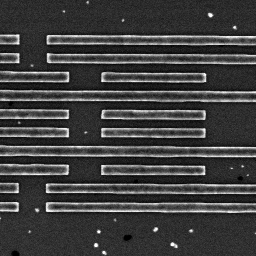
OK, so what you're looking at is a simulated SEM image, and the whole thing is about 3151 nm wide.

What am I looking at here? wiring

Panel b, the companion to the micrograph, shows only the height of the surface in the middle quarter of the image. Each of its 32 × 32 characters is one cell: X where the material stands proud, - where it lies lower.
--------------------------------
--------------------------------
X--------XXXXXXXXXXXXXXXXXXXXXXX
X--------XXXXXXXXXXXXXXXXXXXXXXX
--------------------------------
--------------------------------
--------------------------------
XXXXXXXXXXXXXXXXXXXXXXXXXXXXXXXX
XXXXXXXXXXXXXXXXXXXXXXXXXXXXXXXX
--------------------------------
--------------------------------
--------------------------------
X--------XXXXXXXXXXXXXXXXXXXXXXX
X--------XXXXXXXXXXXXXXXXXXXXXXX
--------------------------------
--------------------------------
X--------XXXXXXXXXXXXXXXXXXXXXXX
X--------XXXXXXXXXXXXXXXXXXXXXXX
--------------------------------
--------------------------------
--------------------------------
XXXXXXXXXXXXXXXXXXXXXXXXXXXXXXXX
XXXXXXXXXXXXXXXXXXXXXXXXXXXXXXXX
--------------------------------
--------------------------------
X--------XXXXXXXXXXXX-----------
X--------XXXXXXXXXXXXXXXXXXXXXXX
X--------XXXXXXXXXXXXXXXXXXXXXXX
--------------------------------
--------------------------------
XXXXXXXXXXXXXXXXXXXXXXXXXXXXXXXX
XXXXXXXXXXXXXXXXXXXXXXXXXXXXXXXX